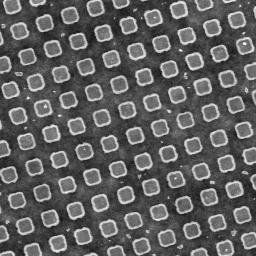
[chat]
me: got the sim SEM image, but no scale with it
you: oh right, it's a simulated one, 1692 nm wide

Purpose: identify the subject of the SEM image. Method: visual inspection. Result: a regular array of raised bodies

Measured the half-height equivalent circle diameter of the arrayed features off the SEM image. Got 109 nanometres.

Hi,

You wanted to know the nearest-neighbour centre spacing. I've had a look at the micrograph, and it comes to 173 nm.